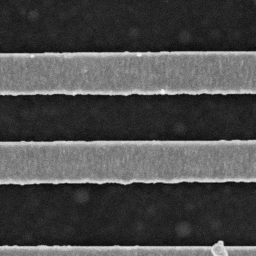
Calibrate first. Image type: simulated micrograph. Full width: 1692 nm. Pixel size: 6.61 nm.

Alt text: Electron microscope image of lines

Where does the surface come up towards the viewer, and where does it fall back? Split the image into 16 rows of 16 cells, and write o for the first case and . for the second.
................
................
................
oooooooooooooooo
oooooooooooooooo
oooooooooooooooo
................
................
................
oooooooooooooooo
oooooooooooooooo
................
................
................
................
oooooooooooooooo